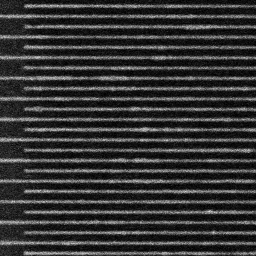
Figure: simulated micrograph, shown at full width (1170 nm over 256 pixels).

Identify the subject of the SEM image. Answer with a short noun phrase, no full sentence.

parallel lines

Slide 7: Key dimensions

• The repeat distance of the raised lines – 47.1 nanometers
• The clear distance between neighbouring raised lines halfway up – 34.9 nm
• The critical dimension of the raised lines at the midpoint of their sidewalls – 13.2 nm